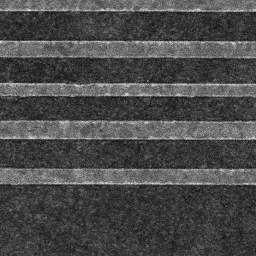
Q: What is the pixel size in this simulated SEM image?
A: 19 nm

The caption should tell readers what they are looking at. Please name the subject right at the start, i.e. parallel lines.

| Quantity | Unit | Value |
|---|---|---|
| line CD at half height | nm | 292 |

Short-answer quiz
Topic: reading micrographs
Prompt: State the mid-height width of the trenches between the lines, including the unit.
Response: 513 nm